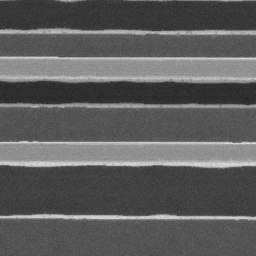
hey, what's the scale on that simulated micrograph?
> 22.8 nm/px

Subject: lines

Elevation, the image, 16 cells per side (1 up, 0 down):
0000000000000000
0000000000000000
1111111111111111
1111111111111111
1111111111111111
0000000000000000
0000000000000000
1111111111111111
1111111111111111
1111111111111111
0000000000000000
0000000000000000
0000000000000000
0000000000000000
1111111111111111
1111111111111111